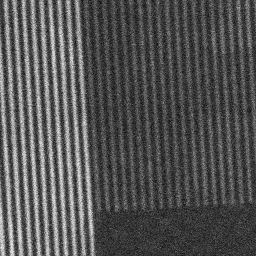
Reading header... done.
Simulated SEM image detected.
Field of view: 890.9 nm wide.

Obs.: parallel lines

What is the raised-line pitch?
31.1 nanometers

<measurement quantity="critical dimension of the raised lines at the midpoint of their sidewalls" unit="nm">9.3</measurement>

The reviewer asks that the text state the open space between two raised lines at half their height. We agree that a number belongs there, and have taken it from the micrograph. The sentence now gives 0.0209 µm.